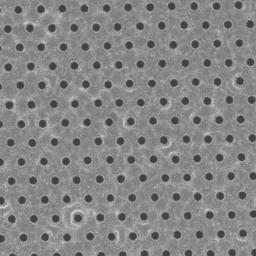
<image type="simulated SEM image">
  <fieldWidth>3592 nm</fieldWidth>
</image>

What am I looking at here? a regular array of holes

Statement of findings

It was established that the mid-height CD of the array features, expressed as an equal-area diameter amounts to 0.113 microns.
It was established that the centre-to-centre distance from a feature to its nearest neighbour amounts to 301 nanometers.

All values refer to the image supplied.